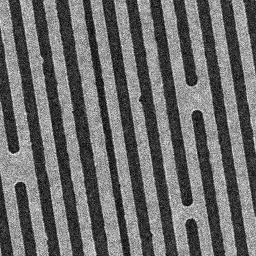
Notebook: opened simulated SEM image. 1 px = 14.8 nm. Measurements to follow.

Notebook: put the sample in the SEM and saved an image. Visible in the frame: parallel lines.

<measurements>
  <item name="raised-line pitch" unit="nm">343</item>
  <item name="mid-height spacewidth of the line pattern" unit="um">0.188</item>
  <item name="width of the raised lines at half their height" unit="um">0.162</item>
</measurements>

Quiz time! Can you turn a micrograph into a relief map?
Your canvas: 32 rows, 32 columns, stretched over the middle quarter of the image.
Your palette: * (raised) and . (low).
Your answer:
....***..***...***...***...***..
*...***...**...***...***...***..
*...****..**....**...***...***..
*...****..***...**....**...***..
*...****..***...**....**....**..
*....***..***...***...***...***.
*....***..***...***...***...****
*....***...**...***...***...****
**...***...**...***...***...****
**...***...**....**....**...****
**...****..***...**....**....***
**....***..***...***...***...***
**....***..***...***...***...***
**....***..***...***...***...***
***...***...**...***...***...***
***...***...**....**....**...***
***...****..***...**....**....**
***....***..***...***...***...**
.**....***..***...***...***...**
.**....***..***...***...***...**
.**....***...**....**...***...**
.***...***...**....**....**....*
.***...***...***...**....**....*
.***....***..***...**....**....*
.***....***..***...***...***...*
..**....***..***...***...***...*
..**....***...**...***...***...*
..***...***...**....**...***...*
..***...***...***...**....**...*
..***....***..***...**....**....
..***....***..***...***...***...
...**....***..***...***...***...